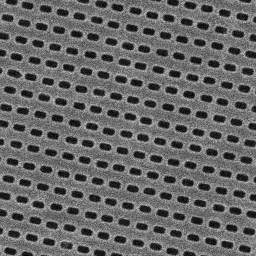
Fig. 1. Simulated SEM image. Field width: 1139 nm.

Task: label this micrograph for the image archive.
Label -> a regular array of holes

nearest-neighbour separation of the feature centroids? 16.9 pixels